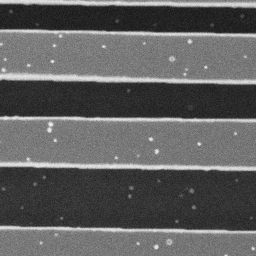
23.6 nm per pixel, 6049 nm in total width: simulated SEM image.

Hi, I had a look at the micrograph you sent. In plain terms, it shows lines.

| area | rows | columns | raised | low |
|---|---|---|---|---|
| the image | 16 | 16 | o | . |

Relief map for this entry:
................
................
oooooooooooooooo
oooooooooooooooo
oooooooooooooooo
................
................
oooooooooooooooo
oooooooooooooooo
oooooooooooooooo
......oooooooooo
................
................
................
oooooooooooooooo
oooooooooooooooo